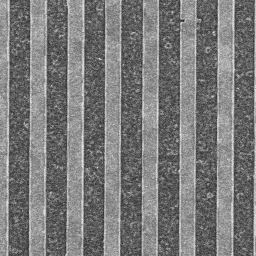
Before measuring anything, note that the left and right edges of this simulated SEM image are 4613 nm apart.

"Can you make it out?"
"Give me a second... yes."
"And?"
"parallel lines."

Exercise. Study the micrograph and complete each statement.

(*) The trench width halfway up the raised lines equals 0.41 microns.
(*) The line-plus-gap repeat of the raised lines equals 0.676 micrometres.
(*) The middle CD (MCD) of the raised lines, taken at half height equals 0.266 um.